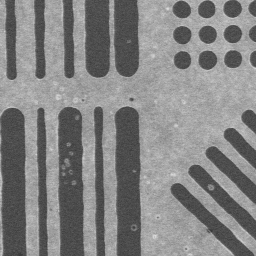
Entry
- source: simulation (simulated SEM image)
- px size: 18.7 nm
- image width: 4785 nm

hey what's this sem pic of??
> groups of lines, slits or small figures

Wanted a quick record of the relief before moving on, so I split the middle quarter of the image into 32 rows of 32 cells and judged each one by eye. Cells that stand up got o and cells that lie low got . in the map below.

...oo.......o......ooooooooo...o
...oo......oo.....ooooooooooo.oo
...ooo.....ooo....oooooooooooooo
o.oooooo.ooooooooooooooooooooooo
oooooooooooooooooooooooooooooooo
oooooooooooooooooooooooooooooooo
oooooooooooooooooooooooooooooooo
oooooooooooooooooooooooooooooooo
oooooooooooooooooooooooooooooooo
oooooooooooooooooooooooooooooooo
o.oooooo.oooooo.oooooooooooooooo
....ooo...oooo....oooooooooooooo
....ooo...ooo......ooooooooooooo
.....oo...oo.......ooooooooooooo
.....oo...oo.......ooooooooooooo
.....oo...ooo......ooooooooooooo
.....oo...ooo......ooooooooooooo
.....ooo..ooo......ooooooooooooo
.....ooo..ooo......ooooooooooooo
.....ooo..ooo......ooooooooooooo
.....ooo..ooo......ooooooooooooo
.....oo...ooo......ooooooooooooo
.....oo...ooo......ooooooooooooo
.....oo...ooo......ooooooooooooo
.....oo...ooo......ooooooooooooo
.....ooo..ooo......ooooooooooooo
.....ooo..ooo......oooooooooooo.
.....ooo..ooo......oooooooooooo.
.....ooo..ooo......ooooooooooooo
.....ooo..ooo......ooooooooooooo
.....ooo..ooo......oooooooo...oo
.....ooo..ooo......ooooooo.....o